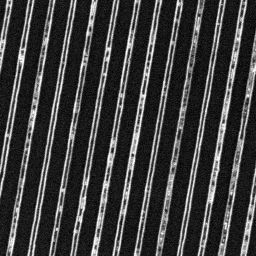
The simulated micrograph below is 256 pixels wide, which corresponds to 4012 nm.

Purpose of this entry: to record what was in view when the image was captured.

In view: parallel lines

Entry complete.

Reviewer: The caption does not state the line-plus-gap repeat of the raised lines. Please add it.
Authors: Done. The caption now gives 0.329 microns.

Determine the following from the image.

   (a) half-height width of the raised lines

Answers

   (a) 67.5 nm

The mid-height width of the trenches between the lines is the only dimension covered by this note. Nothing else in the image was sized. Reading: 268 nm